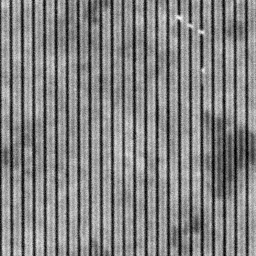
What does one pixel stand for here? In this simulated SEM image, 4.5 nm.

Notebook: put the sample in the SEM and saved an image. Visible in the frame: parallel lines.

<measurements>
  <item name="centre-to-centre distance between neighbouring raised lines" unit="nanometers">50.4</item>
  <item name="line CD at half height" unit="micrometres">0.0321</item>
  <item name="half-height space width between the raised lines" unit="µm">0.0197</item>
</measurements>